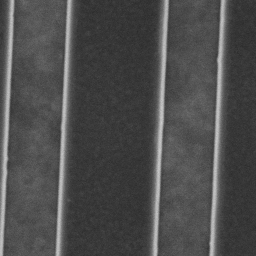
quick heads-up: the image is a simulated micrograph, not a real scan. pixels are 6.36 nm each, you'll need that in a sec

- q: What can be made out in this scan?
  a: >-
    one or a few lines or trenches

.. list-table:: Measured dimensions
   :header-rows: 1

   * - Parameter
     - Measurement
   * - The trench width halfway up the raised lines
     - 354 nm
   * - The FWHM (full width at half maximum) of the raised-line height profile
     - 624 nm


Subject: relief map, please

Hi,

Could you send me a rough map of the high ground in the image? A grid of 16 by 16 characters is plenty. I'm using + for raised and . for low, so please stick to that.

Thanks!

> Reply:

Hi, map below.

+...++++++....++
+...++++++....++
+...++++++....++
+...++++++....++
+...++++++....++
+...++++++....++
+...++++++....++
....++++++....++
....++++++....++
....++++++...+++
....++++++...+++
....++++++...+++
....++++++...+++
....++++++...+++
....++++++...+++
....++++++...+++